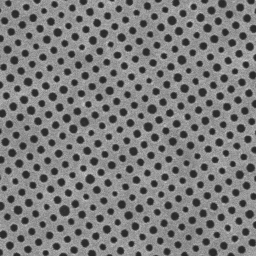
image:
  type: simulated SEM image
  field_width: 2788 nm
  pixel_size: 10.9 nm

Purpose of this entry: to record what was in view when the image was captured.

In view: a regular array of holes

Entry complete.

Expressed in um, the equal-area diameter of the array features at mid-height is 0.0825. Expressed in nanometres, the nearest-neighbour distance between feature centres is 138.